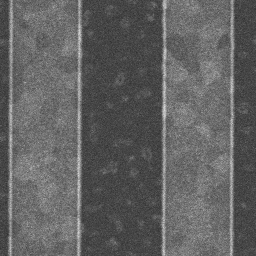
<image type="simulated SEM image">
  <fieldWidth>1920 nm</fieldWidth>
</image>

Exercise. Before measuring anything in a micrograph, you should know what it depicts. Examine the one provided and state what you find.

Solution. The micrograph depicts one or a few lines or trenches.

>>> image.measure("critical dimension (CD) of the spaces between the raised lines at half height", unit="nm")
637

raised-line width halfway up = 510 nm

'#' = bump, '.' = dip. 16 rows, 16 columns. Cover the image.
.####.....####..
.####.....####..
.####.....####..
.####.....####..
.####.....####..
.####.....####..
.####.....####..
.####.....####..
.####.....####..
.####.....####..
.####.....####..
.####.....####..
.####.....####..
.####.....####..
.####.....####..
.####.....####..